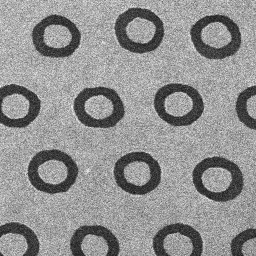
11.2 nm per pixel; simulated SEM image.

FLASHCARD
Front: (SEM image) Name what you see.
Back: a regular array of ring-shaped grooves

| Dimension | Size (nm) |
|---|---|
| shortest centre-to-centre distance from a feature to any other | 858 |